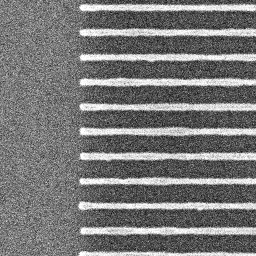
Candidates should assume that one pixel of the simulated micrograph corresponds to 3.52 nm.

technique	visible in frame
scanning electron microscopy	parallel lines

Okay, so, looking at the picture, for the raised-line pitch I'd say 87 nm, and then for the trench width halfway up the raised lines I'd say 68.1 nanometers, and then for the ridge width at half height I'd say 17.6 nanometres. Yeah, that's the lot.